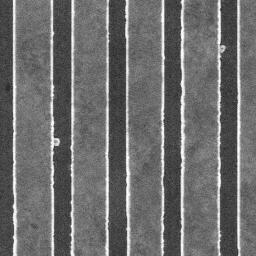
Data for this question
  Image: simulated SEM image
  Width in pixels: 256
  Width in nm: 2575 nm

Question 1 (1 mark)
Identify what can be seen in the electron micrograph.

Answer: lines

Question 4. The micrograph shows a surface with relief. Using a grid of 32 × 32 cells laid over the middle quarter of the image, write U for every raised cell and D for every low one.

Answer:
DDUUUUUUUUUDDDDDUUUUUUUUUDDDDUUU
DDUUUUUUUUUDDDDDUUUUUUUUUDDDDDUU
DDUUUUUUUUUDDDDDUUUUUUUUUDDDDDUU
DDUUUUUUUUUDDDDDUUUUUUUUUDDDDDUU
DDUUUUUUUUUDDDDDUUUUUUUUUDDDDDUU
DDUUUUUUUUUDDDDDUUUUUUUUUDDDDDUU
DDUUUUUUUUUDDDDDUUUUUUUUUDDDDDUU
DDUUUUUUUUUDDDDDUUUUUUUUUDDDDDUU
DDUUUUUUUUUDDDDDUUUUUUUUUDDDDDUU
DDUUUUUUUUUDDDDDUUUUUUUUUDDDDDUU
DDUUUUUUUUUDDDDDUUUUUUUUUDDDDDUU
DDUUUUUUUUUDDDDDUUUUUUUUUDDDDUUU
DDUUUUUUUUUDDDDDUUUUUUUUUDDDDUUU
DDUUUUUUUUUDDDDDUUUUUUUUUDDDDUUU
DDUUUUUUUUUDDDDDUUUUUUUUUDDDDDUU
DDUUUUUUUUUDDDDDUUUUUUUUUDDDDUUU
DDUUUUUUUUUDDDDDUUUUUUUUUDDDDUUU
DDUUUUUUUUUDDDDDUUUUUUUUUDDDDUUU
DDUUUUUUUUUDDDDDUUUUUUUUUDDDDDUU
DDUUUUUUUUUDDDDDUUUUUUUUUDDDDDUU
DDUUUUUUUUUDDDDDUUUUUUUUUDDDDDUU
DDUUUUUUUUUDDDDDUUUUUUUUUDDDDUUU
DDUUUUUUUUUDDDDDUUUUUUUUUDDDDUUU
DDUUUUUUUUUDDDDDUUUUUUUUUDDDDDUU
DDUUUUUUUUUDDDDDUUUUUUUUUDDDDDUU
DDUUUUUUUUUDDDDDUUUUUUUUUDDDDDUU
DDUUUUUUUUUDDDDDUUUUUUUUUDDDDUUU
DDUUUUUUUUUDDDDDUUUUUUUUUDDDDUUU
DDUUUUUUUUUDDDDDUUUUUUUUUDDDDUUU
DDUUUUUUUUUDDDDDUUUUUUUUUDDDDUUU
DDUUUUUUUUUDDDDDUUUUUUUUUDDDDUUU
DDUUUUUUUUUDDDDDUUUUUUUUUDDDDUUU